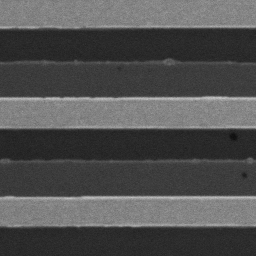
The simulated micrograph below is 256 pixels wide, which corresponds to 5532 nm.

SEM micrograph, lines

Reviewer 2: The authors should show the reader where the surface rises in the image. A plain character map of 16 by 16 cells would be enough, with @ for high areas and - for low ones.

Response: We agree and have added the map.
@@@@@@@@@@@@@@@@
@@@@@@@@@@@@@@@@
----------------
----------------
@@@@@@@@@@@@@@@@
@@@@@@@@@@@@@@@@
@@@@@@@@@@@@@@@@
@@@@@@@@@@@@@@@@
----------------
----------------
@@@@@@@@@@@@@@@@
@@@@@@@@@@@@@@@@
@@@@@@@@@@@@@@@@
@@@@@@@@@@@@@@@@
----------------
----------------